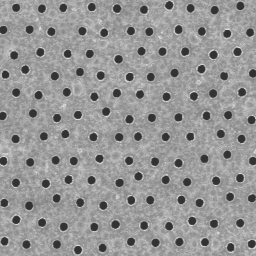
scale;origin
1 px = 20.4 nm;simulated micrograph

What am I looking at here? a regular array of holes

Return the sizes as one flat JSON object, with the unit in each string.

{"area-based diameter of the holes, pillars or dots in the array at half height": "166 nanometres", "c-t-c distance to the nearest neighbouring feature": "427 nm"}